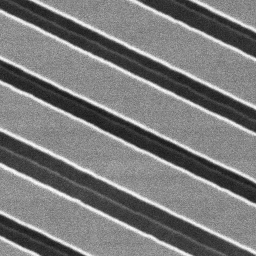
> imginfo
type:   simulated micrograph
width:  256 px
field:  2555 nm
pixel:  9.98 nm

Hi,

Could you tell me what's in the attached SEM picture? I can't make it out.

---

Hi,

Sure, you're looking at lines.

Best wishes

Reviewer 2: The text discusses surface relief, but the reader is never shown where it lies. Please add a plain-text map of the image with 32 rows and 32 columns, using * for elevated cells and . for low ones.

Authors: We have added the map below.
.....*************.......*******
*......*************.......*****
***......*************.......***
*****......*************.......*
*******......*************......
*********......*************....
***********......*************..
*************......*************
..*************......***********
....*************......*********
*.....*************......*******
***.....*************......*****
*****.....*************......***
*******......************.......
*********......*************....
***********......*************..
*************......*************
..*************......***********
....*************......*********
.......*************.....*******
.........*************.....*****
**.........*************.....***
****.........*************.....*
*******........*************....
*********........*************..
***********........*************
*************........***********
..*************........*********
....*************........*******
......*************........*****
**......*************........***
****......*************........*